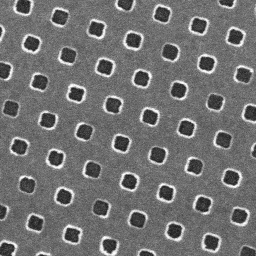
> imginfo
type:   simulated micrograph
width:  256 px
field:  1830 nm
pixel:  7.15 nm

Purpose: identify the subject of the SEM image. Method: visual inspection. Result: a regular array of holes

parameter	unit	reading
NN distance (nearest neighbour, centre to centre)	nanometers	273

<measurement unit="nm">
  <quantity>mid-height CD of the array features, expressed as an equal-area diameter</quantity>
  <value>111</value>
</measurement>